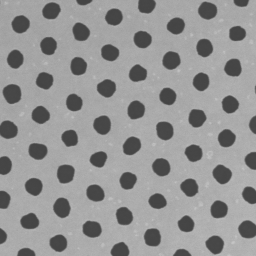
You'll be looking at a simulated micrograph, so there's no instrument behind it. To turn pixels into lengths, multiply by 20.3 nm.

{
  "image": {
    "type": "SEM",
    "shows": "a regular array of holes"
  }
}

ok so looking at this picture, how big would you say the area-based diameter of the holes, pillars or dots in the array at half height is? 354 nm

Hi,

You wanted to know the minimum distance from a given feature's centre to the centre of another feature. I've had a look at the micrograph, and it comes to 700 nanometres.